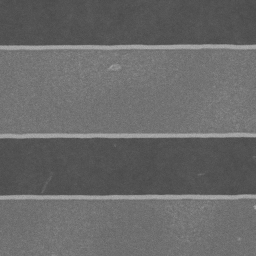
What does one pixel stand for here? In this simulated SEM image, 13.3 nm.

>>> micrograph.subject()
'wiring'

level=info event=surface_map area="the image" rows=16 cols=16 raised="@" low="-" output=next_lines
----------------
----------------
----------------
@@@@@@@@@@@@@@@@
@@@@@@@@@@@@@@@@
@@@@@@@@@@@@@@@@
@@@@@@@@@@@@@@@@
@@@@@@@@@@@@@@@@
@@--------------
----------------
----------------
----------------
@@@@@@@@@@@@@@@@
@@@@@@@@@@@@@@@@
@@@@@@@@@@@@@@@@
@@@@@@@@@@@@@@@@